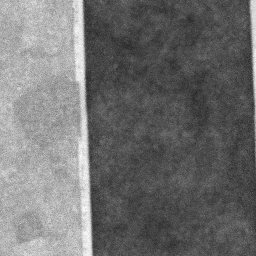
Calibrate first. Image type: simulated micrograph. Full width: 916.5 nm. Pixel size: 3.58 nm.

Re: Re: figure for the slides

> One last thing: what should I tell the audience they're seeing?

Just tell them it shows one or a few lines or trenches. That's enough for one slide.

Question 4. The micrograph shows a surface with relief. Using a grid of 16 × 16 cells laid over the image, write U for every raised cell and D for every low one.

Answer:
UUUUUDDDDDDDDDDD
UUUUUDDDDDDDDDDD
UUUUUDDDDDDDDDDD
UUUUUDDDDDDDDDDD
UUUUUDDDDDDDDDDD
UUUUUDDDDDDDDDDD
UUUUUDDDDDDDDDDD
UUUUUDDDDDDDDDDD
UUUUUDDDDDDDDDDD
UUUUUDDDDDDDDDDD
UUUUUDDDDDDDDDDD
UUUUUDDDDDDDDDDD
UUUUUDDDDDDDDDDD
UUUUUUDDDDDDDDDD
UUUUUUDDDDDDDDDD
UUUUUUDDDDDDDDDD